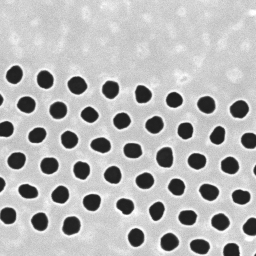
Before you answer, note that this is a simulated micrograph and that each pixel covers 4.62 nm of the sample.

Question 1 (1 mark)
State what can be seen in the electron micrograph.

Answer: a regular array of holes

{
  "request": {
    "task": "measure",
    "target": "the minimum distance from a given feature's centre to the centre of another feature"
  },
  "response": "146 nm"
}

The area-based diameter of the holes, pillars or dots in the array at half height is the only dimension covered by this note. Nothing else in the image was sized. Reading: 78.5 nanometres